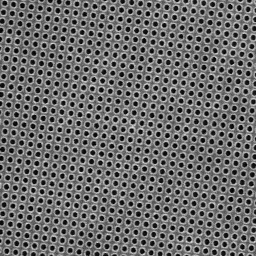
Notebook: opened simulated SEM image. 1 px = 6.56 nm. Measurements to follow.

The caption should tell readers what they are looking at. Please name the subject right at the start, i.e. a regular array of holes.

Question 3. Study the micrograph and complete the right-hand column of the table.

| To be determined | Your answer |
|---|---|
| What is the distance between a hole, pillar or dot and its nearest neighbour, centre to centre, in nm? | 57.9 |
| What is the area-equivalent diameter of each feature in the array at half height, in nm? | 37.8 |